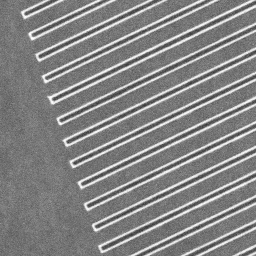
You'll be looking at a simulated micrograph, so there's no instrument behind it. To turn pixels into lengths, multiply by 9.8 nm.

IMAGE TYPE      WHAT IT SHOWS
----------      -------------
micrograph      parallel lines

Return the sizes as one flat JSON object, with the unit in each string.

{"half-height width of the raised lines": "0.0685 um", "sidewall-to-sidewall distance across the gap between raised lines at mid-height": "154 nanometers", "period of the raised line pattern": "0.217 micrometres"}